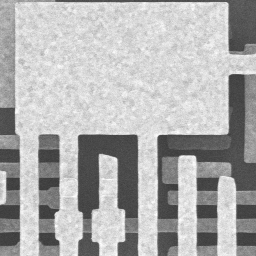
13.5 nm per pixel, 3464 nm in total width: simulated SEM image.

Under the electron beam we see wiring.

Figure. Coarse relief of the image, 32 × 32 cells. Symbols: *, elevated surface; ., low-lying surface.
..**************************....
..**************************....
..**************************....
..**************************....
..**************************....
..**************************....
..***************************...
..******************************
..******************************
..***************************...
..**************************....
..**************************....
..**************************....
..**************************....
..**************************....
..**************************....
..**************************....
...**..***.......***............
...**..***.......***............
...**..***...*...***............
...**..***..***..***..***.......
...**..***..***..***..***.......
*..**..***..***..***..***..**...
*..**..***..***..***..***..**...
*..**..***..***..***..***..**...
...**..***..***..***..***..**...
...**..***..***..***..***..**...
...**..***.*****.***..***..**...
...**..***.*****.***..***..**...
...**..***.*****.***..***..**...
...**..***..***..***..***..**...
...**..***..***..***..***..**...